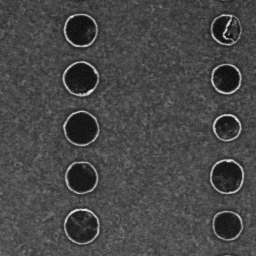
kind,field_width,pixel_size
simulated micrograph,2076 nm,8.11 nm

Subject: a regular array of raised bodies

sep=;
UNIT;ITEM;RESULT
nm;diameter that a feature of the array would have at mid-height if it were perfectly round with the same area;260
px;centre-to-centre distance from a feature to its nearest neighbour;48.8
